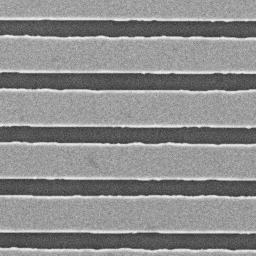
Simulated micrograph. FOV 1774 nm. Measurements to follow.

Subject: lines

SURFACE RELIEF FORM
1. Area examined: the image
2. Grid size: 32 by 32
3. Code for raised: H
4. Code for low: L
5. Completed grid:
HHHHHHHHHHHHHHHHHHHHHHHHHHHHHHHH
HHHHHHHHHHHHHHHHHHHHHHHHHHHHHHHH
LLLLLLLLLLLLLLHHLHHHHHHHHHHHHHHH
LLLLLLLLLLLLLLLLLLLLLLLLLLLLLLLL
HHLHLLLLLLLLLLLLLLLLLLLLLLLLLLLL
HHHHHHHHHHHHHHHHHHHHHHHHHHHHHHHH
HHHHHHHHHHHHHHHHHHHHHHHHHHHHHHHH
HHHHHHHHHHHHHHHHHHHHHHHHHHHHHHHH
HHHHHHHHHHHHHHHHHHHHHHHHHHHHHHHH
LLLLLLLLLLLLLLLLLLLLLLLLLLLLLLLL
LLLLLLLLLLLLLLLLLLLLLLLLLLLLLLLL
HHHHHHHHHHHHHHHHHHHHHHHHHHHHHHHH
HHHHHHHHHHHHHHHHHHHHHHHHHHHHHHHH
HHHHHHHHHHHHHHHHHHHHHHHHHHHHHHHH
HHHHHHHHHHHHHHHHHHHHHHHHHHHHHHHH
HHHHHHHHHHHHHHHHHHHHHHHHHHHHHHHH
LLLLLLLLLLLLLLLLLLLLLLLLLLLLLLLL
LLLLLLLLLLLLLLLLLLLLLLLLLLLLLLLL
HHHHHHHHHHHHHHHHHHHHHHHHHHHHHHHH
HHHHHHHHHHHHHHHHHHHHHHHHHHHHHHHH
HHHHHHHHHHHHHHHHHHHHHHHHHHHHHHHH
HHHHHHHHHHHHHHHHHHHHHHHHHHHHHHHH
LLLLLLLLLLLLLLLLLLLLLLLLLLLLLLLL
LLLLLLLLLLLLLLLLLLLLLLLLLLLLLLLL
HHHHLLLLLHHLHHLLLHHHHHHLLHHHLLLL
HHHHHHHHHHHHHHHHHHHHHHHHHHHHHHHH
HHHHHHHHHHHHHHHHHHHHHHHHHHHHHHHH
HHHHHHHHHHHHHHHHHHHHHHHHHHHHHHHH
HHHHHHHHHHHHHHHHHHHHHHHHHHHHHHHH
LLLLLLLLLLLLLLLLLLLLLLLLLLLLLLLL
LLLLLLLLLLLLLLLLLLLLLLLLLLLLLLLL
HHHHHHHHHHHHHHHHHHHHHHHHHHHHHHHH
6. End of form